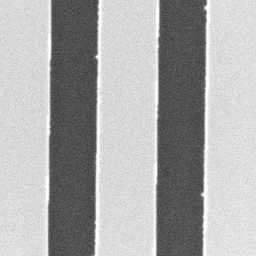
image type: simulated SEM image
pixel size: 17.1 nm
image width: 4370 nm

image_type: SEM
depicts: lines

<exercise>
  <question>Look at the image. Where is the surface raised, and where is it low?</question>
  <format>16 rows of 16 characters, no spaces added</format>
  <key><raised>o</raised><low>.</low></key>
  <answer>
ooo...oooo...ooo
ooo...oooo...ooo
ooo...oooo...ooo
ooo...oooo...ooo
ooo...oooo...ooo
ooo...oooo...ooo
ooo...oooo...ooo
ooo...oooo...ooo
ooo...oooo...ooo
ooo...oooo...ooo
ooo...oooo...ooo
ooo...oooo...ooo
ooo...oooo...ooo
ooo...oooo...ooo
ooo...oooo...ooo
ooo...oooo...ooo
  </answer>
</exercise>